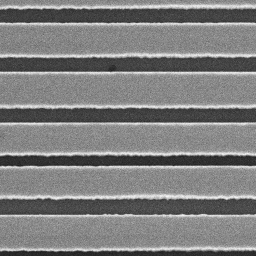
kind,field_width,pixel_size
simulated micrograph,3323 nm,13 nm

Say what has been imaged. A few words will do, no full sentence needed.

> lines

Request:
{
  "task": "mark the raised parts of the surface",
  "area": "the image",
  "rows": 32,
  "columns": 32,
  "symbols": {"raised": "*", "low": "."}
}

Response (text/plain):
********************************
................................
................................
********************************
********************************
********************************
********************************
................................
................................
********************************
********************************
********************************
********************************
.*....***...*.*....**....*......
................................
********************************
********************************
********************************
********************************
................................
................................
********************************
********************************
********************************
********************************
................................
................................
********************************
********************************
********************************
********************************
................................